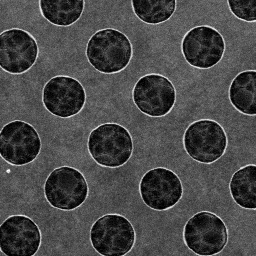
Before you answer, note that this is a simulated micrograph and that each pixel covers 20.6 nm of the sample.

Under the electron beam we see a regular array of holes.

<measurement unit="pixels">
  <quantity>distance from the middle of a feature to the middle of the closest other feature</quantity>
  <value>63.7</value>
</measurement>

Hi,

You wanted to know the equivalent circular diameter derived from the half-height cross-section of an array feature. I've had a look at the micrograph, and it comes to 868 nanometres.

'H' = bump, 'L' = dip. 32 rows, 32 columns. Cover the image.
HHHHHLLLLLHHHHHHHLLLLLHHHHHHHLLL
HHHHHLLLLLHHHHHHHLLLLLHHHHHHHLLL
HHHHHHLLLLHHHHHHHHLLLHHHHHHHHHHL
HHHHHHHHHHHHHHHHHHHHHHHHLLHHHHHH
LLLLHHHHHHHHLLLLHHHHHHHLLLLLHHHH
LLLLLHHHHHHLLLLLHHHHHHHLLLLLHHHH
LLLLLHHHHHHLLLLLHHHHHHHLLLLLHHHH
LLLLHHHHHHHLLLLLHHHHHHHLLLLHHHHH
LLLLHHHHHHHHLLLHHHHHHHHHHHHHHHHH
HHHHHHHHHHHHHHHHHHLLHHHHHHHHHHLL
HHHHHHLLLLHHHHHHHLLLLHHHHHHHHLLL
HHHHHLLLLLLHHHHHHLLLLLHHHHHHHLLL
HHHHHLLLLLLHHHHHHLLLLLHHHHHHHLLL
HHHHHHLLLLHHHHHHHLLLLHHHHHHHHHLL
HHHHHHHLLHHHHHHHHHHLHHHHHHHHHHHH
HLLHHHHHHHHHHLHHHHHHHHHHLLLHHHHH
LLLLLHHHHHHHLLLLHHHHHHHLLLLLHHHH
LLLLLHHHHHHLLLLLHHHHHHHLLLLLHHHH
LLLLLHHHHHHLLLLLLHHHHHHLLLLLHHHH
LLLLLHHHHHHHLLLLHHHHHHHHLLLLHHHH
HHLHHHHHHHHHLLLHHHHHHHHHHHHHHHHH
HHHHHHHLLLHHHHHHHHLLLHHHHHHHHHLL
HHHHHHLLLLLHHHHHHHLLLLHHHHHHHLLL
HHHHHHLLLLLHHHHHHHLLLLLHHHHHHLLL
HHHHHHLLLLLHHHHHHHLLLLLHHHHHHLLL
HHHHHHLLLLHHHHHHHHLLLLHHHHHHHHLL
HHHHHHHHHHHHHHHHHHHHHHHHHHHHHHHH
HLLLHHHHHHHHLLLLHHHHHHHHLLLLHHHH
LLLLLHHHHHHLLLLLLHHHHHHLLLLLHHHH
LLLLLHHHHHHLLLLLLHHHHHHLLLLLHHHH
LLLLLHHHHHHHLLLLLHHHHHHLLLLLHHHH
LLLLHHHHHHHHLLLLHHHHHHHHLLLHHHHH